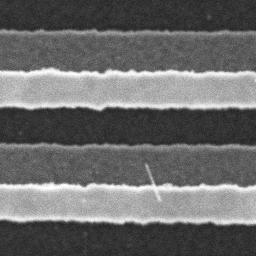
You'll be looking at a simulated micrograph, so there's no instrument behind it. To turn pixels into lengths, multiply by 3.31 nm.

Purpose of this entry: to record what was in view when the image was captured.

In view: lines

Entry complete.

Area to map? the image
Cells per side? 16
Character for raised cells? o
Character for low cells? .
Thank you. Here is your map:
................
................
oooooooooooooooo
oooooooooooooooo
oooooooooooooooo
oooooooooooooooo
oooooooooooooooo
................
................
oooooooooooooooo
oooooooooooooooo
oooooooooooooooo
oooooooooooooooo
oooooooooooooooo
................
................